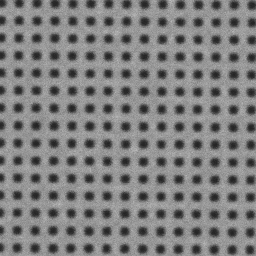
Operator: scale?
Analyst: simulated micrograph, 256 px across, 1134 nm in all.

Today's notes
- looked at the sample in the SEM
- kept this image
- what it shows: a regular array of holes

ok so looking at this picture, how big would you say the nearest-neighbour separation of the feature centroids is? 0.0758 microns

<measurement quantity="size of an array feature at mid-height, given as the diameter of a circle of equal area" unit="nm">43.8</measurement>